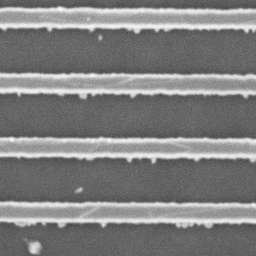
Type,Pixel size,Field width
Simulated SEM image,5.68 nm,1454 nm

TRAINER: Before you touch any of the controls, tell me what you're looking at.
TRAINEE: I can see lines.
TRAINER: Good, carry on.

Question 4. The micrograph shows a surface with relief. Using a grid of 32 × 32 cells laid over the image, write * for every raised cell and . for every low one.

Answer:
................................
********************************
********************************
........................****.*..
................................
................................
................................
................................
................................
********************************
********************************
*..*****************************
................................
................................
................................
................................
................................
********************************
********************************
*..**.*.************************
................................
................................
................................
................................
................................
**********************.*******.*
********************************
********************************
................................
................................
................................
................................